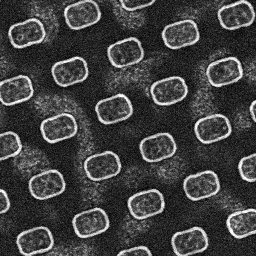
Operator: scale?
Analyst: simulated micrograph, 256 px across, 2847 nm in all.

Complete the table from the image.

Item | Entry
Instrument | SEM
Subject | a regular array of raised bodies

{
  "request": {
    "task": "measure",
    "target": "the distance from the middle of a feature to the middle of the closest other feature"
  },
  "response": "641 nanometres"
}